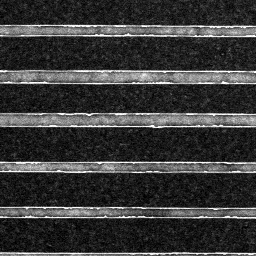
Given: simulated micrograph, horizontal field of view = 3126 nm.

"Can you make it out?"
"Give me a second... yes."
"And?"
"parallel lines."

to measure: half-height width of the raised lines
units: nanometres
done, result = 443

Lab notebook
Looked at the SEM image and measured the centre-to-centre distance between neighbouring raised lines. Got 555 nm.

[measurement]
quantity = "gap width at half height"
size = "118 nm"